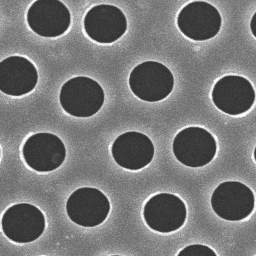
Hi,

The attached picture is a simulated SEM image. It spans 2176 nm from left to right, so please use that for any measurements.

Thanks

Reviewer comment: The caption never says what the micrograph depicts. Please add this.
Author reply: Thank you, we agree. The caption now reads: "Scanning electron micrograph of a regular array of holes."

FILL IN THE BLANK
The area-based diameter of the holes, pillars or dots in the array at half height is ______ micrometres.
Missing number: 0.353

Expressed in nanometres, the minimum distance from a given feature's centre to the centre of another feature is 567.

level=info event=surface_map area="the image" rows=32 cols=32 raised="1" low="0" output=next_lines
11110000111111111111111100111111
11100000011000011111111000011111
11100000011000001111110000001110
11110000111000001111110000001110
11111001111000011111111000011111
11111111111111111111111111111111
11111111111111111111111111111111
00011111111111111111111111111111
00001111111111111000011111111111
00000111111111110000001111110011
00000111000011110000001111100001
00001111000001111000011111100000
11111110000001111100111111100000
11111111000001111111111111100001
11111111100111111111111111111111
11111111111111111111111111111111
11111111111111110111110000111111
11100000111111000001110000011111
11100000111111000001110000011111
11100000111111000001110000011111
11100000111111100001111000111111
11111011111111111111111111111111
11111111111111111111111111111111
11111111110011111111111111100001
11111111100001111110001111000000
11001111000000111100000111000000
10000111000000111100000111100001
00000011100001111100000111110011
00000011111111111110001111111111
10000111111111111111111111111111
11111111111111111111111111111111
11111111111111111111111000011111